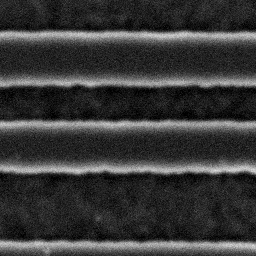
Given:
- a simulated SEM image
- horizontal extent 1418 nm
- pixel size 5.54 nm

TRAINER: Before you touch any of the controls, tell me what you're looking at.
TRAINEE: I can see lines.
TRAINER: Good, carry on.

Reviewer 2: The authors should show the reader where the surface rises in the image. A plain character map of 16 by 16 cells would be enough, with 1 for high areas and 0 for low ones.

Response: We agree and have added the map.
0000000000000000
0000000000000000
1111111111111111
1111111111111111
1111111111111111
0000000000000000
0000000000000000
0000000000000000
1111111111111111
1111111111111111
1111111111111111
0000000000000000
0000000000000000
0000000000000000
0000000000000000
1111111111111111